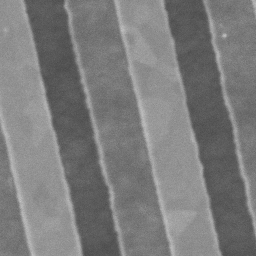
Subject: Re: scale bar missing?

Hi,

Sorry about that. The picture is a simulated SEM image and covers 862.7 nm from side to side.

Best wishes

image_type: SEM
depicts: lines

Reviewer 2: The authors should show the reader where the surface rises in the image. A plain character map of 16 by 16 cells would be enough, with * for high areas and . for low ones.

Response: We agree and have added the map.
**..******...***
**..*******..***
**...******..***
**...******...**
**...******...**
***..******...**
***...******..**
***...******...*
***...******...*
****..******...*
****..*******..*
****...******..*
****...******...
*****..******...
*****..******...
*****...******..